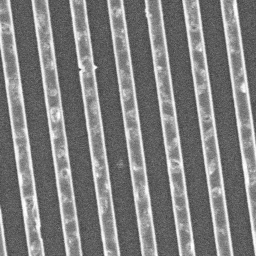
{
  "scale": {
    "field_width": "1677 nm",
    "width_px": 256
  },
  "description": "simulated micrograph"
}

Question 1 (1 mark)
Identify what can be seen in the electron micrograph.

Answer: parallel lines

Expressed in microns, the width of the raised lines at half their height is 0.0925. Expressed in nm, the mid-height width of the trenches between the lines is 149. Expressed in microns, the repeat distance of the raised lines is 0.245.